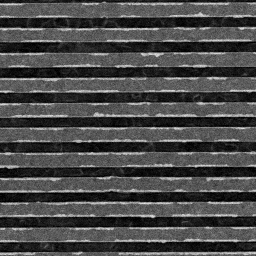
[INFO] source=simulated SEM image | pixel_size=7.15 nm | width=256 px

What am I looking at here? parallel lines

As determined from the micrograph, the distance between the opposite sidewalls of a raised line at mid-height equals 0.104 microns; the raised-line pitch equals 0.178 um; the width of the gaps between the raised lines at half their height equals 76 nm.